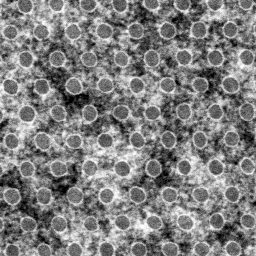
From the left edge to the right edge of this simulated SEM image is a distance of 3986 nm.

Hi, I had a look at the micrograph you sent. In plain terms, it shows a regular array of raised bodies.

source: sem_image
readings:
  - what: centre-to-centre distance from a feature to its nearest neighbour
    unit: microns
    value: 0.483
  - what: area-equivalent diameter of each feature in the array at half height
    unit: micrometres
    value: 0.244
